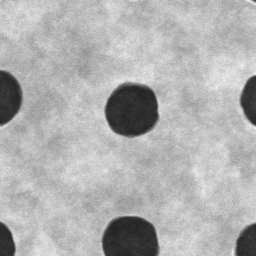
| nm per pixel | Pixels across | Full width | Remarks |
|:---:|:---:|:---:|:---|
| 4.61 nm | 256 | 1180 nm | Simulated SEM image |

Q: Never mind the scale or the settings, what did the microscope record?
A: holes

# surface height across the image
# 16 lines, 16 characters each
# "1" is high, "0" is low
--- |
1111111111111111
1111111111111111
1111111111111111
1111111111111111
1111111111111111
0111111001111110
0111111000111110
0111111000111111
1111111111111111
1111111111111111
1111111111111111
1111111111111111
1111111111111111
1111111111111111
0111111000111110
0111110000111110